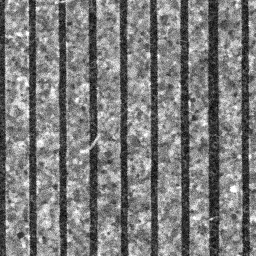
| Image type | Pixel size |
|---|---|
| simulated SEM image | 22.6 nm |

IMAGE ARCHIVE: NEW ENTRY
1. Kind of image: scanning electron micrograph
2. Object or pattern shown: parallel lines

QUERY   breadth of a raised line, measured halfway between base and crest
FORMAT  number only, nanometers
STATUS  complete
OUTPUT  510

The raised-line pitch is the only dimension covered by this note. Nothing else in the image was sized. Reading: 686 nm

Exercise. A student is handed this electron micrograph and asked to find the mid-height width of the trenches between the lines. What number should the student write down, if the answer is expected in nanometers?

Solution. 175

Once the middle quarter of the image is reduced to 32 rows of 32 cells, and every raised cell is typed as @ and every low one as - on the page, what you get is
-@@@@@--@@@@@@--@@@@@---@@@@@--@
-@@@@@--@@@@@@--@@@@@---@@@@@--@
-@@@@@--@@@@@@--@@@@@---@@@@@--@
-@@@@@--@@@@@@--@@@@@---@@@@@--@
-@@@@@--@@@@@@--@@@@@---@@@@@--@
-@@@@@--@@@@@@--@@@-----@@@@@--@
-@@@@@--@@@@@@--@@@@@@--@@@@@--@
-@@@@@--@@@@@@--@@@@@@--@@@@@--@
-@@@@---@@@@@@--@@@@@@--@@@@@--@
-@@@@---@@@@@@--@@@@@@--@@@@@--@
-@@@@@--@@@@@@--@@@@@@--@@@@@--@
-@@@@@--@@@@@@--@@@@@---@@@@@--@
-@@@@@--@@@@@@--@@@@@---@@@@@--@
-@@@@@--@@@@@@--@@@@@---@@@@@--@
-@@@@@--@@@@@@--@@@@@@--@@@@@--@
-@@@@@--@@@@@@--@@@@@@--@@@@@--@
-@@@@@--@@@@@@--@@@@@@--@@@@@--@
-@@@@@---@@@@@--@@@@@---@@@@@--@
-@@@@@--@@@@@@--@@@@@---@@@@@--@
-@@@@@--@@@@@@--@@@@@---@@@@@--@
-@@@@@---@@@@@--@@@@@---@@@@@--@
-@@@@@---@@@@@--@@@@@---@@@@@--@
-@@@@@---@@@@@--@@@@@---@@@@@--@
-@@@@@---@@@@@--@@@@@---@@@@@--@
-@@@@@---@@@@@--@@@@@---@@@@@--@
-@@@@@---@@@@@--@@@@@@--@@@@@--@
-@@@@@---@@@@@--@@@@@@--@@@@@---
-@@@@@---@@@@@--@@@@@@--@@@@@---
-@@@@@---@@@@@--@@@@@@--@@@@@---
-@@@@@---@@@@@--@@@@@@--@@@@@---
-@@@@@---@@@@@--@@@@@@--@@@@@---
-@@@@@---@@@@@--@@@@@@--@@@@@---